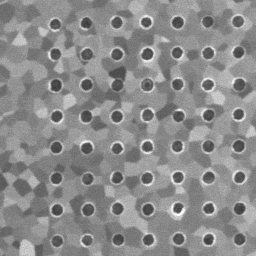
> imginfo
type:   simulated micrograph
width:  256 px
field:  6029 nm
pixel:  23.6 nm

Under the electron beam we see a regular array of holes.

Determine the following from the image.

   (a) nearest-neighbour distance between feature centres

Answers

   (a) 0.709 µm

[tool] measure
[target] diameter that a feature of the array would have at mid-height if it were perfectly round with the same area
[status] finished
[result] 290 nm